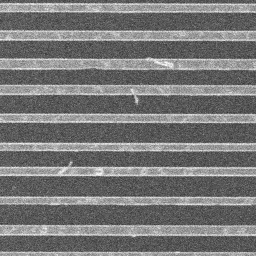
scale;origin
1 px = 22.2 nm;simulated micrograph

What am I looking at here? parallel lines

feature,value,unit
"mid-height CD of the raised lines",177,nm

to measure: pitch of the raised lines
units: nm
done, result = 616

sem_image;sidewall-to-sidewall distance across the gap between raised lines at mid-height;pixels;19.5